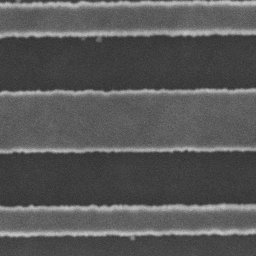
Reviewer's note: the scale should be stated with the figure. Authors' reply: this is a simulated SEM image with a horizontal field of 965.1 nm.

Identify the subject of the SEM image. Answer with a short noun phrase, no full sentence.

lines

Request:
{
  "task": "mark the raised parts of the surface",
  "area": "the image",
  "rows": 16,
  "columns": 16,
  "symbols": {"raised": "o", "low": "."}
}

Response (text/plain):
oooooooooooooooo
oooooooooooooooo
................
................
................
................
oooooooooooooooo
oooooooooooooooo
oooooooooooooooo
ooooo...........
................
................
................
oooooooooooooooo
oooooooooooooooo
................